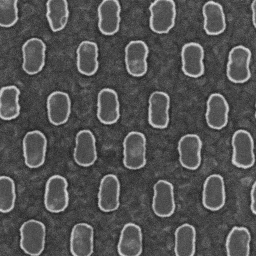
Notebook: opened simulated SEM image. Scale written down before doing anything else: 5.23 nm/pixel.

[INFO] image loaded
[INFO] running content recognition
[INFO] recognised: a regular array of raised bodies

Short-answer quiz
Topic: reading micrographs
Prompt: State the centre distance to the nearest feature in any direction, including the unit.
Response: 250 nanometers